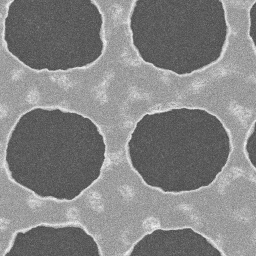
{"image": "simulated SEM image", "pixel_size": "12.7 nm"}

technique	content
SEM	holes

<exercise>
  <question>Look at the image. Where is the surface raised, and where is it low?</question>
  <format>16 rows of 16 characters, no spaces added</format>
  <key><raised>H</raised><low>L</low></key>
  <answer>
HLLLLLHHLLLLLLHH
LLLLLLHHLLLLLLHH
LLLLLLHHLLLLLLHH
HLLLLLHHHLLLLLHH
HHHHHHHHHHHLHHHH
HHHHHHHHHHHHHHHH
HHHHHHHHHHHHHHHH
HLLLLLHHHLLLLLHH
HLLLLLHHLLLLLLHH
LLLLLLLHLLLLLLHL
LLLLLLHHLLLLLLHH
HLLLLLHHHLLLLHHH
HHHHHHHHHHHHHHHH
HHHHHHHHHHHHHHHH
HLLLLHHHHHLLHHHH
HLLLLLHHLLLLLHHH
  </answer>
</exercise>